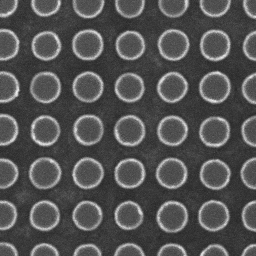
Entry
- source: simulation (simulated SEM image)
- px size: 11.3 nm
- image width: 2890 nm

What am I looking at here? a regular array of raised bodies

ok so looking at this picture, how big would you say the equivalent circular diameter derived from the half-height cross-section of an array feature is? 338 nm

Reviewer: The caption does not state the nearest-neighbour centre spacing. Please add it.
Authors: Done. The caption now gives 468 nm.